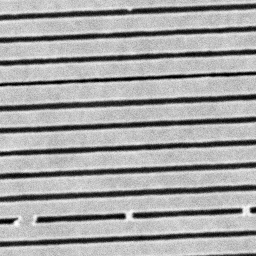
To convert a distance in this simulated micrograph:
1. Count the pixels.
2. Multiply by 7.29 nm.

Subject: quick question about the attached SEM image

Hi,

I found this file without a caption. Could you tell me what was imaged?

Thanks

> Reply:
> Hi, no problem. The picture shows parallel lines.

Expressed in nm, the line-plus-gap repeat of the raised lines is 165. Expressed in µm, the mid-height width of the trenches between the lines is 0.0446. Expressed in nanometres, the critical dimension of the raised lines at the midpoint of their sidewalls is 122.